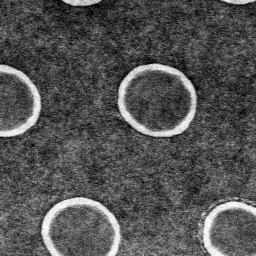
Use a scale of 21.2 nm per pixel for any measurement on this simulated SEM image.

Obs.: raised bodies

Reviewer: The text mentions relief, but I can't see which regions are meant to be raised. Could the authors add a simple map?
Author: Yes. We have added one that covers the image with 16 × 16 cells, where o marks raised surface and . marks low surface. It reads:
................
................
................
................
o.......ooo.....
oo......oooo....
oo......oooo....
oo......oooo....
................
................
................
................
................
...oooo......ooo
...oooo......ooo
...oooo......ooo